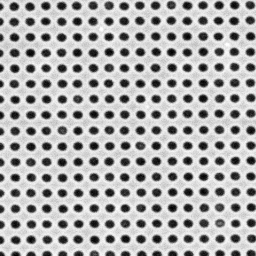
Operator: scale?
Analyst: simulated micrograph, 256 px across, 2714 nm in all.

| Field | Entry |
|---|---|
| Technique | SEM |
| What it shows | a regular array of holes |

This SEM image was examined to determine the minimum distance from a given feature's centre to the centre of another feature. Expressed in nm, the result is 162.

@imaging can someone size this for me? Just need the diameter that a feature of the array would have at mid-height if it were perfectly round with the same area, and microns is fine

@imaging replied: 0.108